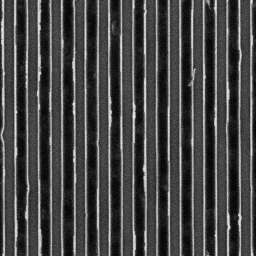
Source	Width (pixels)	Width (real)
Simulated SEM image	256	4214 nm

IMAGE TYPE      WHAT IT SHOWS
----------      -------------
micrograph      parallel lines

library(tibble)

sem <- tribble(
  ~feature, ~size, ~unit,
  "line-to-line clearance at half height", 173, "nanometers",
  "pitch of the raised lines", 388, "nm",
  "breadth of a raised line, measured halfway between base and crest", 13.1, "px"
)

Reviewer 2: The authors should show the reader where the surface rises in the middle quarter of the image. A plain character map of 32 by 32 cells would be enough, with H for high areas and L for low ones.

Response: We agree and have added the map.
HHHLLHHHLLLHHHLLLHHHLLLHHHLLLHHH
HHHLLHHHLLLHHHLLLHHHLLLHHHLLLHHH
HHHLLHHHLLLHHHLLLHHHLLLHHHLLLHHH
HHHLLHHHLLLHHHLLLHHHLLLHHHLLLHHH
HHHLLHHHLLLHHHLLLHHHLLLHHHLLLHHH
HHHLLHHHLLLHHHLLLHHHLLLHHHLLLHHH
HHHLLHHHLLLHHHLLLHHHLLLHHHLLLHHH
HHHLLHHHLLLHHHLLLHHHLLLHHHLLLHHH
HHHLLHHHLLLHHHLLLHHHLLLHHHLLLHHH
HHHLLHHHHLLHHHLLLHHHLLLHHHLLLHHH
HHHLLHHHHLLHHHLLLHHHLLLHHHLLLHHH
HHHLLHHHHLLHHHLLLLHHLLLHHHLLLHHH
HHHLLLHHHLLHHHLLLHHHLLLHHHLLLHHH
HHHLLLHHHLLHHHLLLHHHLLLHHHLLLHHH
HHHLLLHHHLLHHHLLLHHHLLLHHHLLLHHH
HHHLLLHHHLLHHHLLLHHHLLLHHHLLLHHH
HHHLLLHHHLLHHHLLLHHHLLLHHHLLLHHH
HHHLLLHHHLLHHHLLLHHHLLLHHHLLLHHH
HHHLLLHHHLLHHHLLLHHHLLLHHHLLLHHH
HHHLLLHHLLLHHHLLLHHHLLLHHHLLLHHH
HHHLLLHHHLLHHHLLLHHHLLLHHHLLLHHH
HHHLLLHHHLLHHHLLLHHHLLLHHHLLLHHH
HHHLLLHHHLLHHHLLLHHHLLLHHHLLLHHH
HHHLLLHHHLLHHHLLLHHHLLLHHHLLLHHH
HHHLLLHHHLLHHHLLLHHHLLLHHHLLLHHH
HHHLLLHHHLLHHHLLLHHHLLLHHHLLLHHH
HHHLLLHHHLLHHHLLLHHHLLLHHHLLLHHH
HHHLLLHHHLLHHHLLLHHHLLLHHHLLLHHH
HHHLLLHHHLLHHHLLLHHHLLLHHHLLLHHH
HHHLLLHHHLLHHHLLLHHHLLLHHHLLLHHH
HHHLLLHHHLLHHHLLLHHHLLLHHHLLLHHH
HHHLLLHHHLLHHHHLLHHHLLLHHHLLLHHH